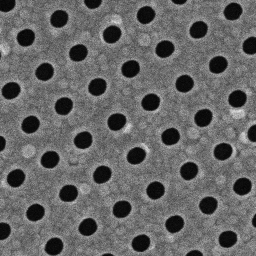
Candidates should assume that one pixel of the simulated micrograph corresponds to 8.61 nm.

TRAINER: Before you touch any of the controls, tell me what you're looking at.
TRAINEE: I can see a regular array of holes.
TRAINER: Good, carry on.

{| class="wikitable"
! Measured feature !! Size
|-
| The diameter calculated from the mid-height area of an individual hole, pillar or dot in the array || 154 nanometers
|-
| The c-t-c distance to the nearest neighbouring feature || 331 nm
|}